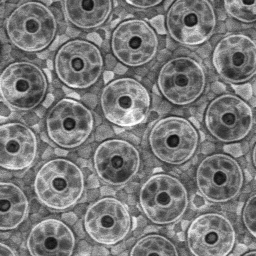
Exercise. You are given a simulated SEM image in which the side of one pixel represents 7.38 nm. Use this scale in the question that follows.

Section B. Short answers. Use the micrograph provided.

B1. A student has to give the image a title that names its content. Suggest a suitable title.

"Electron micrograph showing a regular array of ring-shaped raised bodies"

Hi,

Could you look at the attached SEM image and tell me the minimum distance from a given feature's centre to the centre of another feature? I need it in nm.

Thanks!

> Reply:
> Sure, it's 442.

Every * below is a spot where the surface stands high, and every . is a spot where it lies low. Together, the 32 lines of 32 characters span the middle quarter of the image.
**...****................*******
***..****...............********
*********...............****..**
********................****...*
*******......*****......****...*
..****.....********.....****..**
..........**********....********
..........***********....*******
..........****...****.....******
***......****....****......****.
****......****...****...........
******....***********...........
*******...**********............
..*****....*********......*.....
...****.....*******.....*******.
...****................*********
..*****...............**********
******................*****.****
*****.................****...***
****.......****.......***....***
**.......********.....****...***
........**********....**********
........**********.....*********
........****...****.....*******.
*.......****...****.......****..
***.....****...***..............
****....**********..............
****.....********...............
****.....*******......*****.....
.****......****......********...
.****...............*********...
****...............***********..